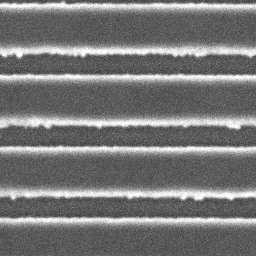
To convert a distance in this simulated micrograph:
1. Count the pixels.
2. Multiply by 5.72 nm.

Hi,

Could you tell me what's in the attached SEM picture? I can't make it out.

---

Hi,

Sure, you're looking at lines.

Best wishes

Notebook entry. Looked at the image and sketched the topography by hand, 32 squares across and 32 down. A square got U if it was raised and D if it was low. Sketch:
DDDDDDDDDDDDDDDDDDDDDDDDDDDDDDDD
UUUUUUUUUUUUUUUUUUUUUUUUUUUUUUUU
UUUUUUUUUUUUUUUUUUUUUUUUUUUUUUUU
UUUUUUUUUUUUUUUUUUUUUUUUUUUUUUUU
UUUUUUUUUUUUUUUUUUUUUUUUUUUUUUUU
UUUUUUUUUUUUUUUUUUUUUUUUUUUUUUUU
UUUUUDDUUUUUUUUUUUUUUUDDDUUUUUUU
DDDDDDDDDDDDDDDDDDDDDDDDDDDDDDDD
DDDDDDDDDDDDDDDDDDDDDDDDDDDDDDDD
UDDUDDDDUUDDDDDUUDDDDUUDDDDDDDDD
UUUUUUUUUUUUUUUUUUUUUUUUUUUUUUUU
UUUUUUUUUUUUUUUUUUUUUUUUUUUUUUUU
UUUUUUUUUUUUUUUUUUUUUUUUUUUUUUUU
UUUUUUUUUUUUUUUUUUUUUUUUUUUUUUUU
UUUUUUUUUUUUUUUUUUUUUUUUUUUUUUUU
DDDDDDDDDDUUUUUUUUUUUUUDDDDUDDDD
DDDDDDDDDDDDDDDDDDDDDDDDDDDDDDDD
DDDDDDDDDDDDDDDDDDDDDDDDDDDDDDDD
UUUUUUUUUUUUUUUUUUUUUUUUUUUUUUUU
UUUUUUUUUUUUUUUUUUUUUUUUUUUUUUUU
UUUUUUUUUUUUUUUUUUUUUUUUUUUUUUUU
UUUUUUUUUUUUUUUUUUUUUUUUUUUUUUUU
UUUUUUUUUUUUUUUUUUUUUUUUUUUUUUUU
UUUUUUUUUUUUUUUUUUUUUUUUUUUUUUUU
DDDDDDDDDDDDDDDDDDDDDDDDDDDUUUDD
DDDDDDDDDDDDDDDDDDDDDDDDDDDDDDDD
DDDDDDDDDDDDDDDDDDDDDDDDDDDDDDDD
UUUUUUUUUUUUUUUUUUUUUUUUUUUUUUUU
UUUUUUUUUUUUUUUUUUUUUUUUUUUUUUUU
UUUUUUUUUUUUUUUUUUUUUUUUUUUUUUUU
UUUUUUUUUUUUUUUUUUUUUUUUUUUUUUUU
UUUUUUUUUUUUUUUUUUUUUUUUUUUUUUUU